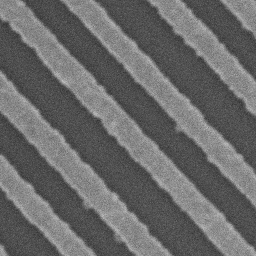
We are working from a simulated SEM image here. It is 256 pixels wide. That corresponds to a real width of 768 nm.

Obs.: lines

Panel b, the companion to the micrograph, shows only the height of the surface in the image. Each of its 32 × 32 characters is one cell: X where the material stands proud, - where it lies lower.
XXX-----XXXX-------XXXX-----XXXX
XXXX-----XXXX-------XXXX-----XXX
-XXXX-----XXXX-------XXXX-----XX
--XXXX-----XXXX-------XXXX-----X
---XXXX-----XXXX-------XXXX-----
---XXXXX-----XXXX-------XXXX----
-----XXXX-----XXXX-------XXX----
-----XXXX------XXXX-------XXXX--
------XXXX------XXXX-------XXX--
X------XXXX------XXX-------XXXX-
XX------XXXX------XXX-------XXXX
XX-------XXXX------XXX-------XXX
XXX-------XXXX------XXX-------XX
XXXX-------XXXX-----XXXX-------X
-XXXX-------XXXX-----XXXX-------
--XXXX-------XXXX-----XXXX------
---XXXX-------XXXX-----XXXX-----
----XXXX-------XXXX-----XXXX----
-----XXXX-------XXXX-----XXXX---
-----XXXXX------XXXXX-----XXXX--
X-----XXXXX-------XXXX-----XXXX-
XX-----XXXXX-------XXXX-----XXXX
XXX-----XXXXX-------XXXX-----XXX
XXXX-----XXXX-------XXXX------XX
-XXXX-----XXXXX-------XXX------X
--XXXX-----XXXX-------XXXX------
---XXXX-----XXXX-------XXXX-----
----XXXX-----XXXX-------XXXX----
-----XXXX-----XXXX-------XXXX---
------XXXX-----XXXX-------XXXX--
-------XXXX-----XXXX-------XXXX-
X-------XXXX-----XXXX-------XXXX